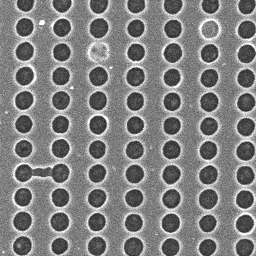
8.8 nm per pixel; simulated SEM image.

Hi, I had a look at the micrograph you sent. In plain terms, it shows a regular array of holes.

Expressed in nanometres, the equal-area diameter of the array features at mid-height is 163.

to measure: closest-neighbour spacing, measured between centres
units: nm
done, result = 212